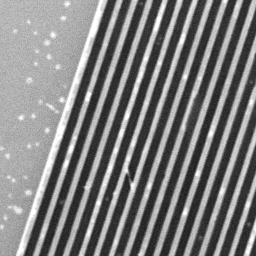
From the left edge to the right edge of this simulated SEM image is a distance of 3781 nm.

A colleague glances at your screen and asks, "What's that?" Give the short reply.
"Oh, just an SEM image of parallel lines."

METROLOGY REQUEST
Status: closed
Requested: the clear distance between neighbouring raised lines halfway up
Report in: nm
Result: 137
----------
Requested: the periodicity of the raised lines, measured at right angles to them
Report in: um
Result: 0.212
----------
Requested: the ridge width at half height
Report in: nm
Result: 73.7